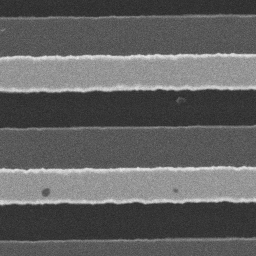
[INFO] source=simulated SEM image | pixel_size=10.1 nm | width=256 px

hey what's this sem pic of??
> lines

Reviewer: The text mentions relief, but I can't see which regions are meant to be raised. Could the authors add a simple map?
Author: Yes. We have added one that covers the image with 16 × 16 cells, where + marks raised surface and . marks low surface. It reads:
................
++++++++++++++++
++++++++++++++++
++++++++++++++++
++++++++++++++++
++++++++++++++++
................
................
++++++++++++++++
++++++++++++++++
++++++++++++++++
++++++++++++++++
++++++++++++++++
................
................
++++++++++++++++